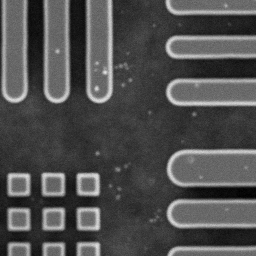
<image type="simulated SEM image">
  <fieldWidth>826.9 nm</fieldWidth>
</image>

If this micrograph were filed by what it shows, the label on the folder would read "groups of lines, slits or small figures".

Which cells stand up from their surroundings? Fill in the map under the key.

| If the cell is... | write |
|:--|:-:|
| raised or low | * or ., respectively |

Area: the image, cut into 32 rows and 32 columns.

***...**...***.......***********
***...**...***........**********
***...**...***..................
***...**...***..................
***...**...***..................
***...**...***.......***********
***...**...***.......***********
***...**...***..................
***...***..***..................
***...***..***..................
***...***..***.......***********
***...**...***.......***********
.*.....*....*........***********
................................
................................
................................
................................
................................
................................
......................**********
.....................***********
.....................***********
.***.***..**..........**********
.***.***..**....................
................................
......................**********
.***.***..**.........***********
.***.***..**.........***********
.***..**..**....................
................................
..........*.....................
.***.***..**.........***********